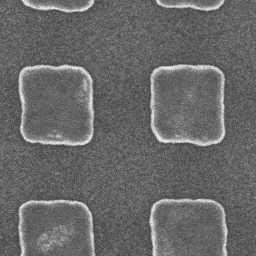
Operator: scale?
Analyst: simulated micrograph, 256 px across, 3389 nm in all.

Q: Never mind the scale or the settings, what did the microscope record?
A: raised bodies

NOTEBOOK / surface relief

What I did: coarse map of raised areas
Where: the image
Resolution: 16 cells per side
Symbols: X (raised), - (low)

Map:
--XXX-------X---
----------------
----------------
----------------
-XXXX-----XXXX--
-XXXXX---XXXXX--
-XXXXX---XXXXX--
-XXXXX----XXXX--
--XXXX----XXXX--
----------------
----------------
----------------
----------------
-XXXXX---XXXXX--
-XXXXX---XXXXX--
-XXXXX----XXXX--